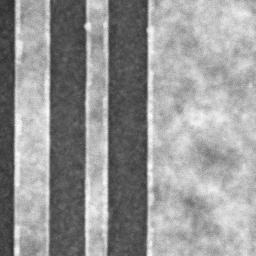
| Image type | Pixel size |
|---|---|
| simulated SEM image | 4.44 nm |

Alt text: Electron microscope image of one or a few lines or trenches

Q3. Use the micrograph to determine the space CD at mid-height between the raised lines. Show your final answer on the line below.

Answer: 0.174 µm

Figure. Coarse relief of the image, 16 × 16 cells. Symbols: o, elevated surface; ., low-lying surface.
.oo..oo..ooooooo
.oo..oo..ooooooo
.oo..oo..ooooooo
.oo..oo..ooooooo
.oo..oo..ooooooo
.oo..oo..ooooooo
.oo..oo..ooooooo
.oo..oo..ooooooo
.oo..oo..ooooooo
.oo..oo..ooooooo
.oo..oo..ooooooo
.oo..oo..ooooooo
.oo..oo..ooooooo
.oo..oo..ooooooo
.oo..oo..ooooooo
.oo..oo..ooooooo